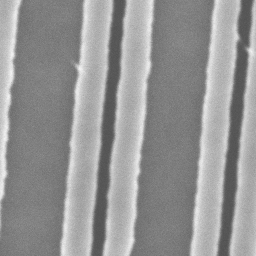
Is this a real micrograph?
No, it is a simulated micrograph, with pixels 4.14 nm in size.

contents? lines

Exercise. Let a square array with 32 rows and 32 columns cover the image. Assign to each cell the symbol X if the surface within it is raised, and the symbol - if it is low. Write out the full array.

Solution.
XX---------XXX--XXX--------XXX--
XX---------XXX--XXX--------XXX--
XX---------XXX--XXX--------XXX--
XX--------XXXX--XXX--------XXX--
XX--------XXXX-XXXX--------XXX-X
XX--------XXX--XXXX-------XXXX-X
XX--------XXX--XXXX-------XXX--X
XX--------XXX--XXXX-------XXX--X
XX--------XXX--XXXX-------XXX--X
XX--------XXX--XXX--------XXX--X
X---------XXX--XXX--------XXX--X
X--------XXXX--XXX--------XXX--X
X--------XXXX--XXX--------XXX--X
X--------XXXX--XXX--------XXX--X
X--------XXXX--XXX-------XXXX--X
X--------XXXX-XXXX-------XXXX-XX
X--------XXXX-XXXX-------XXX--XX
X--------XXXX-XXXX-------XXX--XX
X--------XXXX-XXXX-------XXX--XX
X--------XXX--XXXX-------XXX--XX
X--------XXX--XXX--------XXX--XX
X--------XXX--XXX--------XXX--XX
---------XXX--XXX--------XXX--XX
---------XXX--XXX--------XXX--XX
--------XXXX-XXXX--------XXX--XX
--------XXXX--XXX--------XXX--XX
--------XXXX-XXXX-------XXXX-XXX
--------XXXX-XXXX-------XXX--XXX
--------XXX--XXXX-------XXX--XXX
--------XXX--XXXX-------XXX--XXX
--------XXX--XXXX-------XXX--XXX
--------XXX--XXX--------XXX--XXX